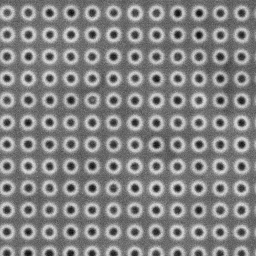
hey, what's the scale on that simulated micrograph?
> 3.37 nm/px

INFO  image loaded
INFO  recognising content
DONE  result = a regular array of holes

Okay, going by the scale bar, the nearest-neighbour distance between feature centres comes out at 0.0715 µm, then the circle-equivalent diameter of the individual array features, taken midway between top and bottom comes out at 9.82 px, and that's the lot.